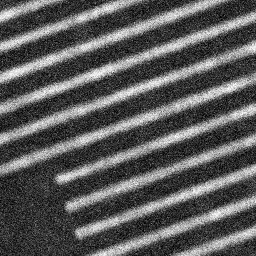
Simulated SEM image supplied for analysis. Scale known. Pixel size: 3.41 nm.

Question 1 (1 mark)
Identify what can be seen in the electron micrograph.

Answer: parallel lines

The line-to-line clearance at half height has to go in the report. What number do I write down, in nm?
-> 77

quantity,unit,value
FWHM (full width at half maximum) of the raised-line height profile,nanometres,20.8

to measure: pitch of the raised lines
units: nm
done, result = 98.3